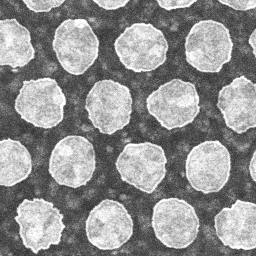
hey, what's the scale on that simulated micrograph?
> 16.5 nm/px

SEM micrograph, a regular array of raised bodies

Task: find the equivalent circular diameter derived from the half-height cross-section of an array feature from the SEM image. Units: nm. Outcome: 800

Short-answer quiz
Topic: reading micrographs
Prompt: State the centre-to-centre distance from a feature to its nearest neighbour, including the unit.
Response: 1080 nm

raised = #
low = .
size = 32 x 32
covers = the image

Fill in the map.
...#####....####....####....####
................................
.#.......#......................
###....####.....###.....####....
####...#####...#####...######..#
####...#####..#######..######..#
####...#####...######..######...
####...#####...######..#####....
........###.....###......###....
................................
...####.....###......###.....###
...#####...#####...######...####
..######...#####..#######..#####
..######...#####..#######..#####
...#####...#####...#####....####
....###.....####....###.....####
.............#..................
.#......###.....................
###....#####....####....####....
####..######...######...#####...
####..######...######..######..#
####..######...######..######..#
###....####....#####....####....
.................##.....####....
................................
...###......###.....###......###
..#####....#####...#####....####
..######...#####...######..#####
...#####...######..######..#####
...#####...#####....####...#####
...###......###......###....####
................................